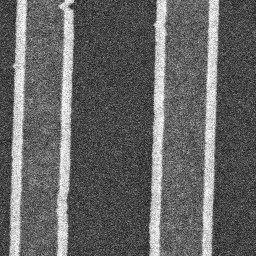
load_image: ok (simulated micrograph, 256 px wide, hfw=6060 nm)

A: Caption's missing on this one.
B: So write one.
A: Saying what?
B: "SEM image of one or a few lines or trenches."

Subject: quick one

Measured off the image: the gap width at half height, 2170 nanometres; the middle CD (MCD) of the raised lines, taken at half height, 1200 nm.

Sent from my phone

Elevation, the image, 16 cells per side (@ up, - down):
-@@@------@@@---
-@@@------@@@---
-@@@------@@@---
-@@@------@@@---
-@@@------@@@---
-@@@------@@@---
-@@@------@@@---
-@@@------@@@---
-@@@------@@@---
-@@@------@@@---
-@@@------@@@---
-@@@------@@@---
-@@@------@@@---
-@@@------@@@---
-@@@------@@@---
-@@@------@@@---